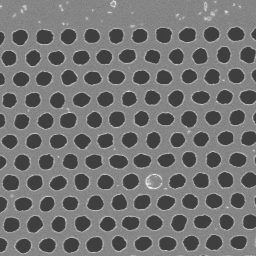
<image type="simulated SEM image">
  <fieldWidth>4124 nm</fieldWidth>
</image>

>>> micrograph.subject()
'a regular array of holes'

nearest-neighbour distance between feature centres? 375 nm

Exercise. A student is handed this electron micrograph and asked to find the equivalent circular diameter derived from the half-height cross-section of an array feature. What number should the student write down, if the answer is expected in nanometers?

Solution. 245